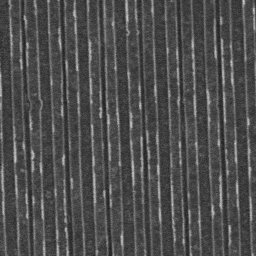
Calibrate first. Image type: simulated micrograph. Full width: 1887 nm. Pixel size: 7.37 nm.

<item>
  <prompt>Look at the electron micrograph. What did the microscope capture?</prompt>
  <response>parallel lines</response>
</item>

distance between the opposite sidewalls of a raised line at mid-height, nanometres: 82.8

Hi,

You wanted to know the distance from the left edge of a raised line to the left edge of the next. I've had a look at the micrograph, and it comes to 0.142 um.